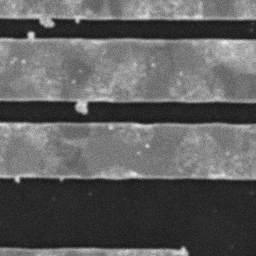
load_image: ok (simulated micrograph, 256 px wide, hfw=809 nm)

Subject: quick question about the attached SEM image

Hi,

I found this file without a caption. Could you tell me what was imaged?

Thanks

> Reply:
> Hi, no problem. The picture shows wiring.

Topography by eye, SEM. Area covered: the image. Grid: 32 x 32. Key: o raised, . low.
oooooooooooooooooooooooooooooooo
oooooooooooooooooooooooooooooooo
.....o..........................
................................
................................
oooooooooooooooooooooooooooooooo
oooooooooooooooooooooooooooooooo
oooooooooooooooooooooooooooooooo
oooooooooooooooooooooooooooooooo
oooooooooooooooooooooooooooooooo
oooooooooooooooooooooooooooooooo
oooooooooooooooooooooooooooooooo
oooo..oooooooooooooooooooooooooo
..........o.....................
................................
oooo...oo....oooo...............
ooooooooooooooooo.oooooooooooooo
oooooooooooooooooooooooooooooooo
oooooooooooooooooooooooooooooooo
oooooooooooooooooooooooooooooooo
oooooooooooooooooooooooooooooooo
oooooooooooooooooooooooooooooooo
................................
................................
................................
................................
................................
................................
................................
................................
................................
ooooooooooooooooooooooo.........